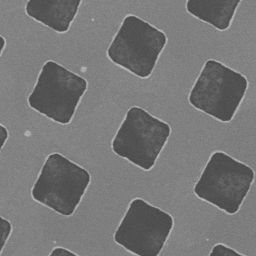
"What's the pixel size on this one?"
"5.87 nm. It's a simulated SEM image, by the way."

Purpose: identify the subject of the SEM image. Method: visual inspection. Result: holes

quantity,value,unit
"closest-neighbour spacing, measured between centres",91.7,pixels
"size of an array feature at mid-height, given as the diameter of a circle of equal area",54.5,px